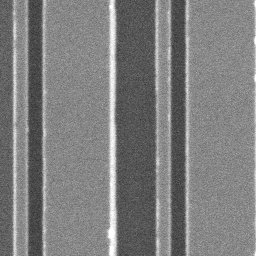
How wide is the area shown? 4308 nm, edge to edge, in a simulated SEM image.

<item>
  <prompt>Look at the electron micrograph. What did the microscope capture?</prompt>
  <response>lines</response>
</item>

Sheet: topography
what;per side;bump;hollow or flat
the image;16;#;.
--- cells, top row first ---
.######...######
.######...######
.######...######
.######...######
.######...######
.######...######
.######...######
.######...######
.######...######
.######...######
.######...######
.######...######
.######...######
.######...######
.######...######
.######...######